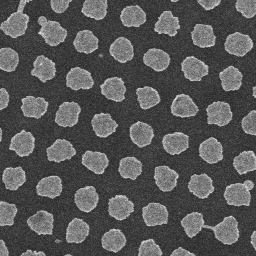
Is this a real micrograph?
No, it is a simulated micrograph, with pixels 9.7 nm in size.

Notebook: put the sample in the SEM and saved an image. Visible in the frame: a regular array of raised bodies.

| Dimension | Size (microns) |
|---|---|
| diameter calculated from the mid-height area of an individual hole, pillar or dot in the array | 0.229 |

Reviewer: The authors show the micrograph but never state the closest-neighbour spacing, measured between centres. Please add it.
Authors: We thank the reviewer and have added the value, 35.3 px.